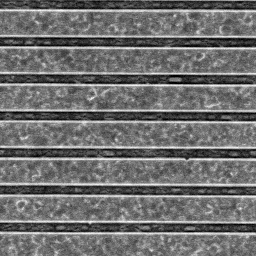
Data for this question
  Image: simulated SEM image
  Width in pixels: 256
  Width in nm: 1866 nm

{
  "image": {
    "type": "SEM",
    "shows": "parallel lines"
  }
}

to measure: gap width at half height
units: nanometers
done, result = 76.5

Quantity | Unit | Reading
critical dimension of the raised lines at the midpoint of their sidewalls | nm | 194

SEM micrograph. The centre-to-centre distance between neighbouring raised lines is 270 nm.